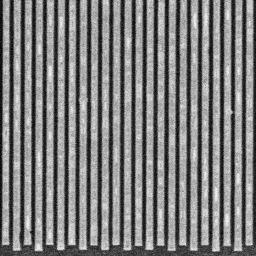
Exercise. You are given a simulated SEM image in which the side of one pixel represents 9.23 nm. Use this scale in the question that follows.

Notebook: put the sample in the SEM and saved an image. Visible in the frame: parallel lines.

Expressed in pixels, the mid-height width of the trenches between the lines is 4.99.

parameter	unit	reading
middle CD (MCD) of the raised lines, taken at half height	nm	62.3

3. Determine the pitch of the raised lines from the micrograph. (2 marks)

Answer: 102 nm